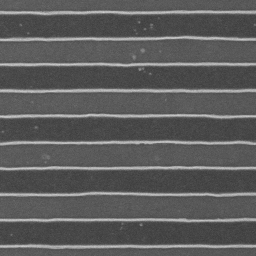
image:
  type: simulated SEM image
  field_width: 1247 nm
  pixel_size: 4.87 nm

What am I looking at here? parallel lines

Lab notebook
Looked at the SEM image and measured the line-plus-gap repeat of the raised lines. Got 0.253 microns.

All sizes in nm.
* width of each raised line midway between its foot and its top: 132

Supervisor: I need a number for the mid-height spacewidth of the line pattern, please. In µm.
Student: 0.12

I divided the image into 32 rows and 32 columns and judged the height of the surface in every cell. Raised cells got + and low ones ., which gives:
................................
............+++.......+.++......
++++++++++++++++++++++++++++++++
++++++++++++++++++++++++++++++++
++++++++++++++++++++++++++++++++
................................
................................
................................
++++++++++++++++++++++++++++++++
++++++++++++++++++++++++++++++++
++++++++++++++++++++++++++++++++
................................
................................
................................
.......+..++++.......+++........
++++++++++++++++++++++++++++++++
++++++++++++++++++++++++++++++++
++++++++++++++++++++++++++++++++
................................
................................
................................
++++++++++++++++++++++++++++++++
++++++++++++++++++++++++++++++++
++++++++++++++++++++++++++++++++
................................
................................
................................
...++.++++.++++..+++.........+++
++++++++++++++++++++++++++++++++
++++++++++++++++++++++++++++++++
++++++++++++++++++++++++++++++++
................................